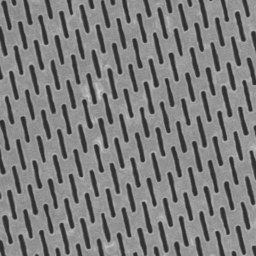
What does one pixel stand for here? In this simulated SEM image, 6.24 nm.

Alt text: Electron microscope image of a regular array of holes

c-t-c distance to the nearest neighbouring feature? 132 nm